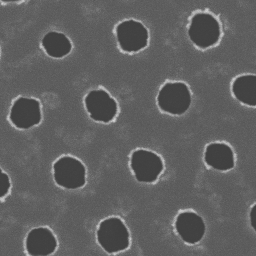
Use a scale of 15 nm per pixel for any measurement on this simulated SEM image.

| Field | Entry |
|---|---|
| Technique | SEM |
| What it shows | a regular array of holes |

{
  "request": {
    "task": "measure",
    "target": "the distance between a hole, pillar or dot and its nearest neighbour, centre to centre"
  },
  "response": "1110 nanometres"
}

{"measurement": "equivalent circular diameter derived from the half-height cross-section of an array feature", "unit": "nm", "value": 472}